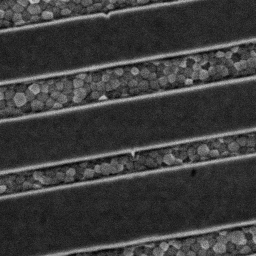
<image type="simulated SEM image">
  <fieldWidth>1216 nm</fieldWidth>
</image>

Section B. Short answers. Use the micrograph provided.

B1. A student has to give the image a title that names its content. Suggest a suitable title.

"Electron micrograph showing one or a few lines or trenches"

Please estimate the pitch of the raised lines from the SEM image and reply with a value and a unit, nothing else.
407 nm